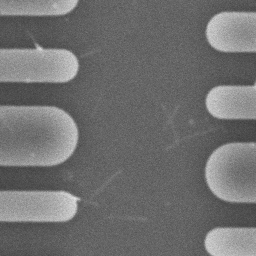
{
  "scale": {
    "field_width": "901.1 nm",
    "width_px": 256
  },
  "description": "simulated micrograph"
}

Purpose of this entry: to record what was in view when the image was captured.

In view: groups of lines, slits or small figures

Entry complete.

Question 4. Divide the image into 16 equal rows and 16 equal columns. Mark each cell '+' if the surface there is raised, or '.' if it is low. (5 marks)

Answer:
+++++...........
.............+++
.............+++
+++++...........
+++++...........
..............++
.............+++
+++++...........
+++++...........
+++++........+++
.............+++
.............+++
+++++.........++
++++............
.............+++
.............+++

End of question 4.